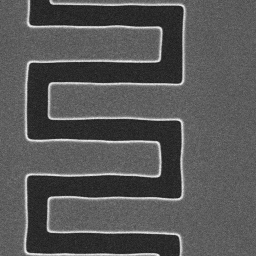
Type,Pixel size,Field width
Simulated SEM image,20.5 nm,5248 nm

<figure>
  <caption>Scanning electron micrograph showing groups of lines, slits or small figures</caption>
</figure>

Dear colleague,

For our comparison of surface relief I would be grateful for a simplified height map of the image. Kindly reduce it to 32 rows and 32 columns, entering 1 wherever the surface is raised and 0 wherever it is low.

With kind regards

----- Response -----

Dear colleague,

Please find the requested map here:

11110000111111111111111111111111
11110000000000000000000111111111
11110000000000000000000111111111
11111111111111111111000111111111
11111111111111111111000111111111
11111111111111111111000111111111
11111111111111111111000111111111
11111111111111111111000111111111
11100000000000000000000111111111
11100000000000000000000111111111
11100011111100010000001111111111
11100011111111111111111111111111
11100011111111111111111111111111
11100011111111111111111111111111
11100011111111111111111111111111
11100000000000000000000111111111
11100000000000000000000111111111
11110000000000000000000111111111
11111111111111111111000111111111
11111111111111111111000111111111
11111111111111111111000111111111
11111111111111111111000111111111
11100000000000000000000111111111
11100000000000000000000111111111
11100000000000000000000111111111
11100011111111111111111111111111
11100011111111111111111111111111
11100011111111111111111111111111
11100011111111111111111111111111
11100000000000000000001111111111
11100000000000000000000111111111
11110000000000000000000111111111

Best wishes